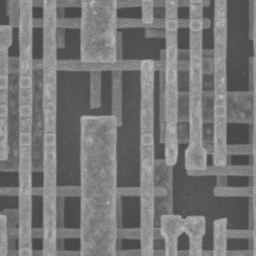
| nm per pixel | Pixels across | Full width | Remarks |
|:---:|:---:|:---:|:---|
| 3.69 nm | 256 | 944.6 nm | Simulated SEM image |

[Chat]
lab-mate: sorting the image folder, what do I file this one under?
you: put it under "wiring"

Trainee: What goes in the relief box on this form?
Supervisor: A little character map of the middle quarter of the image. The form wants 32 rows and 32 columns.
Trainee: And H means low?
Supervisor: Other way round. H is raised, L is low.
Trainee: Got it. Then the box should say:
HHHHHHHHHHHHHHHHHHHHHHHHHHHHHHHH
LLHHHHHLLLLLLLLLLLLHHHHLLHHHHLLH
LLLLLLLLLLLLLLLLLLLHHHLLLHHHLLLH
LLLLLLLLLLLLLLLLLLLHHHLLLHHHLLLH
LLLLLLLLLLLLLLLLLLLHHHLLLHHHLLLH
LLLLLLLLLLLLLLLLLLLHHHLLLHHHLLLH
LLLLLLLLLLLLLLLLLLLHHHLLLHHHLLLH
LLLLLLLLLLLLLLLLLLLHHHLLLHHHHHHH
LLLLLLLLLLLLLLLLLLLHHHLLLHHHHLHH
LLLLLLLLLLLLLLLLLLLHHHLLLHHHHHHH
LLLLLLLLLLLLLLLLLLLHHHLLLHHHHHHH
LLLLLLLLLLLLLLLLLLLHHHLLLHHHHHHH
LLLLLLLLLLLLLLLLLLLHHHLLLHHHHHLH
LLLLHHHHHHHHHLLLLLLHHHLLLHHHHHHH
LLLLHHHHHHHHHLLLLLLHHHLLLHHHHLLH
LLLLHHHHHHHHHLLLLLLHHHLLLLHHLLLH
LLLLHHHHHHHHHLLLLLLHHHLLLHHHLLLH
LLLLHHHHHHHHHLLLLLLHHHLLLHHHLLLL
LLLLHHHHHHHHHLLLLLLHHHLLLHHHLLLL
LLLLHHHHHHHHHLLLLLLHHHLLLHHHLLLH
LLLLHHHHHHHHHLLLLLLHHHLLLHHHLLLH
LLLLHHHHHHHHHLLLLLLHHHLLLHHHLLLH
LLLLHHHHHHHHHLLLLLLHHHLLLHHHLLHH
LLLLHHHHHHHHHLLLLLLHHHLLLHHHLLHH
LLLLHHHHHHHHHLLLLLLHHHLLLHHHLLHH
LLLLHHHHHHHHHLLLLLLHHHLLLLLLLLHH
LLLLHHHHHHHHHLLLLLLHHHLLLLLLLLLH
LLLLHHHHHHHHHLLLLLLHHHLLLLLLLLLH
LLLLHHHHHHHHHLLLLLLHHHLLLLLLLLLL
LLLLHHHHHHHHHLLLLLLHHHLLLLLLLLLL
LLLLHHHHHHHHHLLLLLLHHHLLLLLLLLLL
HHHHHHHHHHHHHHHHHHHHHHHHHLLLLLLL